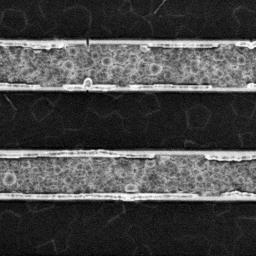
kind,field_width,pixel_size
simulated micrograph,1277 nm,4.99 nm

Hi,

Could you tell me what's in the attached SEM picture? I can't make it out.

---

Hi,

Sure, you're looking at one or a few lines or trenches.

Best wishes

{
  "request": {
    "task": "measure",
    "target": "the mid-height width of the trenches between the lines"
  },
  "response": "314 nanometres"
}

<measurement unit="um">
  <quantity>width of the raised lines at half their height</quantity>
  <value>0.236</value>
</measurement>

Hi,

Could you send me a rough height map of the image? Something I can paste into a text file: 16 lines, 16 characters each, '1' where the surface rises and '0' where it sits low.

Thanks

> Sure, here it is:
0000000000000000
0000000000000000
0000000000000000
1111111111111111
1111111111111111
1111111111111111
0000000000000000
0000000000000000
0000000000000000
0001111100000000
1111111111111111
1111111111111111
0000000110000000
0000000000000000
0000000000000000
0000000000000000